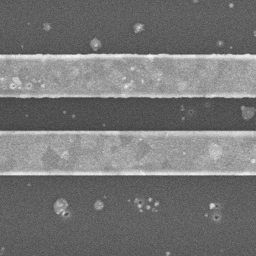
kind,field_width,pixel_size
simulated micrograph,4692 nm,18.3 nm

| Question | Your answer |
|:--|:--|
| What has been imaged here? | lines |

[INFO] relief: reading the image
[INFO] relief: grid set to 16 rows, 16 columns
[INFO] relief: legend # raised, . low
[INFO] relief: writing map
................
................
................
################
################
################
................
................
################
################
################
................
................
................
................
................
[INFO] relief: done